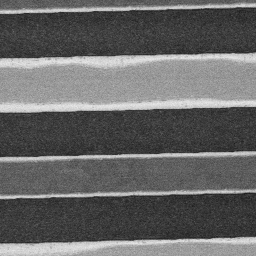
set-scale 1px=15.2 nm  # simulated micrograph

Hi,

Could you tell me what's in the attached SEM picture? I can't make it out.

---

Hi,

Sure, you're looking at lines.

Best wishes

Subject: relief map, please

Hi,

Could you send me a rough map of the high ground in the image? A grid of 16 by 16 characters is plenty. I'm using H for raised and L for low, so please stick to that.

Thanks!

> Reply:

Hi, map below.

HHHHHHHHHHHHHLLL
LLLLLLLLLLLLLLLL
LLLLLLLLLLLLLLLL
LLLLLLLLLLLLHHHL
HHHHHHHHHHHHHHHH
HHHHHHHHHHHHHHHH
HHHHHHHHHHHHHHHH
LLLLLLLLLLLLLLLL
LLLLLLLLLLLLLLLL
LLLLLLLLLLLLLLLH
HHHHHHHHHHHHHHHH
HHHHHHHHHHHHHHHH
LLLLLLLLLLLLLLLL
LLLLLLLLLLLLLLLL
LLLLLLLLLLLLLLLL
HHHHHHHHHHHHHHHH